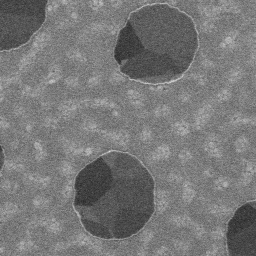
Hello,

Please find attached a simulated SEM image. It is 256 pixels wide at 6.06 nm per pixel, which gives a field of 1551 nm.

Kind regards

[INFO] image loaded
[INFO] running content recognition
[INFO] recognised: raised bodies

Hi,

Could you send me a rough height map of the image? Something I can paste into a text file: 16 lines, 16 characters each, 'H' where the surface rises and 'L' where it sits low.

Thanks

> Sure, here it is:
HHHLLLLLLHHLLLLL
HHHLLLLLHHHHLLLL
HHLLLLLHHHHHLLLL
LLLLLLLHHHHHLLLL
LLLLLLLLHHHHLLLL
LLLLLLLLLLLLLLLL
LLLLLLLLLLLLLLLL
LLLLLLLLLLLLLLLL
LLLLLLLLLLLLLLLL
LLLLLLLHLLLLLLLL
LLLLLHHHHLLLLLLL
LLLLLHHHHHLLLLLL
LLLLLHHHHHLLLLLL
LLLLLHHHHLLLLLHH
LLLLLLHHHLLLLLHH
LLLLLLLLLLLLLLHH